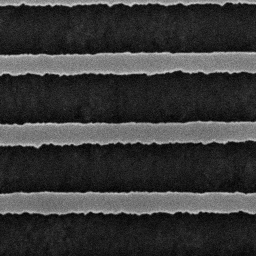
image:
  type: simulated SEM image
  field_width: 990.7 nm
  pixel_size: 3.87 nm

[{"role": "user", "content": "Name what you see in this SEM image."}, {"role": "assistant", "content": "lines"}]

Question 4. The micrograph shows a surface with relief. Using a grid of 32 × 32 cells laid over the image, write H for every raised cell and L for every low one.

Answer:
HHHHHHHHHHHLLHLHHHLLHHLHLLLHLLLL
LLLLLLLLLLLLLLLLLLLLLLLLLLLLLLLL
LLLLLLLLLLLLLLLLLLLLLLLLLLLLLLLL
LLLLLLLLLLLLLLLLLLLLLLLLLLLLLLLL
LLLLLLLLLLLLLLLLLLLLLLLLLLLLLLLL
LLLLLLLLLLLLLLLLLLLLLLLLLLLLLLLL
LLLLLLLLLLLLLLLLLLLLLLLLLLLLLLLL
HHHHHHHHHHHHHHHHHHHHHHHHHHHHHHHH
HHHHHHHHHHHHHHHHHHHHHHHHHHHHHHHH
LLLLLLLLLLLLLLLLLLLLLLLLLLLLLLLL
LLLLLLLLLLLLLLLLLLLLLLLLLLLLLLLL
LLLLLLLLLLLLLLLLLLLLLLLLLLLLLLLL
LLLLLLLLLLLLLLLLLLLLLLLLLLLLLLLL
LLLLLLLLLLLLLLLLLLLLLLLLLLLLLLLL
LLLLLLLLLLLLLLLLLLLLLLLLLLLLLLLL
LLLHHHHLHHLHHHLHHHHHHHHHHHHHHHHH
HHHHHHHHHHHHHHHHHHHHHHHHHHHHHHHH
HHHHHHHHHHHHHHHHHHHHHHHHHHHHHHHH
LLLLLLLLLLLLLLLLLLLLLLLLLLLLLLLL
LLLLLLLLLLLLLLLLLLLLLLLLLLLLLLLL
LLLLLLLLLLLLLLLLLLLLLLLLLLLLLLLL
LLLLLLLLLLLLLLLLLLLLLLLLLLLLLLLL
LLLLLLLLLLLLLLLLLLLLLLLLLLLLLLLL
LLLLLLLLLLLLLLLLLLLLLLLLLLLLLLLL
HHHHHHHHHHHHHHHHHHHHHHHHHHHHHHHH
HHHHHHHHHHHHHHHHHHHHHHHHHHHHHHHH
HHHHHHHHHHHLHHHHHHHHLHLHHLHHHLLH
LLLLLLLLLLLLLLLLLLLLLLLLLLLLLLLL
LLLLLLLLLLLLLLLLLLLLLLLLLLLLLLLL
LLLLLLLLLLLLLLLLLLLLLLLLLLLLLLLL
LLLLLLLLLLLLLLLLLLLLLLLLLLLLLLLL
LLLLLLLLLLLLLLLLLLLLLLLLLLLLLLLL